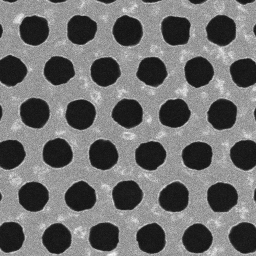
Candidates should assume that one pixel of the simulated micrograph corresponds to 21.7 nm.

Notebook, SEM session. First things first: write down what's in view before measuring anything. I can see a regular array of holes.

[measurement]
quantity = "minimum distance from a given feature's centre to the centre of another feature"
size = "1.01 µm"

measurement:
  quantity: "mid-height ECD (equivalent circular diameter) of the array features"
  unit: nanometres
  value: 654